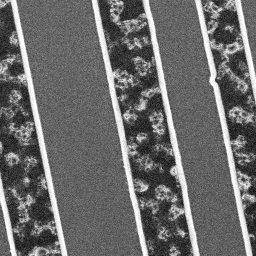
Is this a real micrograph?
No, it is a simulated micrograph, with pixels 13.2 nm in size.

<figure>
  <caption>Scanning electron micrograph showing one or a few lines or trenches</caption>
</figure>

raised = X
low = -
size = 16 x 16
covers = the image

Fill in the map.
X-----XXX---XXX-
X-----XXX----XX-
X-----XXXX---XX-
XX-----XXX---XXX
XX-----XXX---XXX
XX-----XXX---XXX
XX-----XXX----XX
XX-----XXXX---XX
XXX-----XXX---XX
XXX-----XXX---XX
XXX-----XXX---XX
XXX-----XXX----X
XXX-----XXXX---X
XXXX-----XXX---X
-XXX-----XXX---X
-XXX-----XXX---X